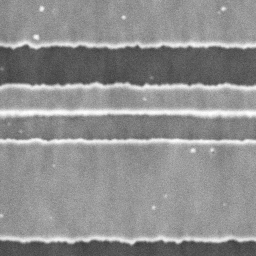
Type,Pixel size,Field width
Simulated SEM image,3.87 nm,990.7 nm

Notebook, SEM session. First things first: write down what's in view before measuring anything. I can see lines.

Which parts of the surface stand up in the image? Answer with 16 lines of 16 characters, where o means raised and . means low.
oooooooooooooooo
oooooooooooooooo
oooooooooooooooo
................
................
oooooooooooooooo
oooooooooooooooo
oooooooooooooooo
oooooooooooooooo
oooooooooooooooo
oooooooooooooooo
oooooooooooooooo
oooooooooooooooo
oooooooooooooooo
oooooooooooooooo
................